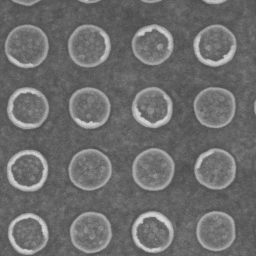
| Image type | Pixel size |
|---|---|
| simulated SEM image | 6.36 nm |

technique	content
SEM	a regular array of raised bodies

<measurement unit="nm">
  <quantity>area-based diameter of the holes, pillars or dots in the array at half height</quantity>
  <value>256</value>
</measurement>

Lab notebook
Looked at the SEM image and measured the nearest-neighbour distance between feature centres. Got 392 nanometers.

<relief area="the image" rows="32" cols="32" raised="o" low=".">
...o............................
................................
................................
..ooo.....oo......oo......oo....
.ooooo...oooo....oooo....oooo...
.ooooo...ooooo...ooooo..ooooo...
.ooooo...ooooo...oooo...ooooo...
.oooo....oooo.....oo.....oooo...
................................
................................
................................
..ooo.....oo......oo.....oooo...
.ooooo...oooo....oooo...ooooo...
.ooooo...ooooo...oooo...ooooo...
.ooooo...oooo....oooo....oooo...
..ooo.....ooo.....oo.....ooo....
................................
................................
................................
..ooo....oooo....oooo....oooo...
.ooooo...ooooo...ooooo...oooo...
.ooooo...ooooo...ooooo..ooooo...
.ooooo...oooo....oooo....oooo...
..ooo.....oo......oo.......o....
................................
................................
................................
..ooo....oooo....oooo....oooo...
.ooooo...ooooo...ooooo...oooo...
.ooooo...ooooo...ooooo...oooo...
..oooo...oooo....oooo....oooo...
..oo............................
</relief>